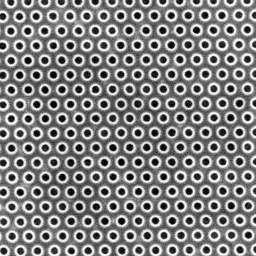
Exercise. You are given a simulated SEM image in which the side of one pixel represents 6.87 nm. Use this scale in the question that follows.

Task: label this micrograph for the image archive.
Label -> a regular array of holes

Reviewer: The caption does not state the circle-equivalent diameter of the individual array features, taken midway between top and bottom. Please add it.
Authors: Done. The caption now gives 8.73 px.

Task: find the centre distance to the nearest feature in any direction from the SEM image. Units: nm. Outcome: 114